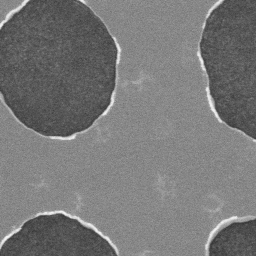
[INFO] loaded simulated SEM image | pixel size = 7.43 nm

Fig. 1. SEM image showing holes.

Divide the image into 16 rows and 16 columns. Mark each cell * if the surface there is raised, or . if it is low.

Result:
*.....*******...
......*******...
.......******...
.......******...
.......******...
.......******...
.......******...
*.....********..
***.************
****************
****************
****************
****************
**..************
*.....********..
.......******...